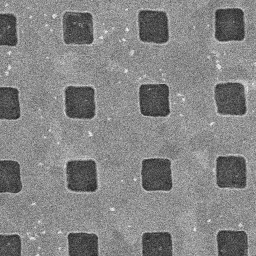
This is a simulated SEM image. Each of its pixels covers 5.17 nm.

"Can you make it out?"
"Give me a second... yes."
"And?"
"a regular array of holes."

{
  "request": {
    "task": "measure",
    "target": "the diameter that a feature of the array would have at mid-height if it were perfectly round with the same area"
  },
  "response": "0.18 um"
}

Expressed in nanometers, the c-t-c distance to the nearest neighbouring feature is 380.